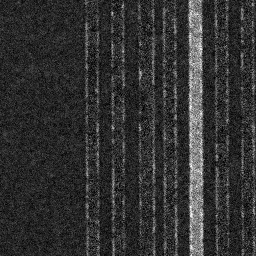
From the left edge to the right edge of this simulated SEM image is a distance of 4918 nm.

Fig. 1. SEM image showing parallel lines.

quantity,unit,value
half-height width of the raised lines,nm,226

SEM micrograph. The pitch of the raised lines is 497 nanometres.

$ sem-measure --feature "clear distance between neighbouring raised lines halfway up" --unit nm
274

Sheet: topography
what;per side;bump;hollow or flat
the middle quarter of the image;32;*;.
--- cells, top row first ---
......**....***....***...***....
......**....***....***...***....
......**....***....***...***....
......**....***....***...***....
......**....***....***...***....
......**....***....***...***....
......**....***....***...***....
......**....***....***...***....
......**....***....***...***....
......**....***....***...***....
......**....***....***...***....
......**....***....***...***....
......**....***....***...***....
......**....***....***...***....
......**....***....***...***....
......**....***....***...***....
......***...***....***...***....
......***...***....***...***....
......***...***....***...***....
......***...***....***...***....
......***...***....***...***....
......***...***....***...***....
......***...***....***...***....
......***...***....***...***....
......***...***....***...***....
......***...***....***...***....
......***...***....***...***....
......***...***....***...***....
......***...***....***...***....
......***...***....***...***....
......***...***....***...***....
......***...***....***..****....